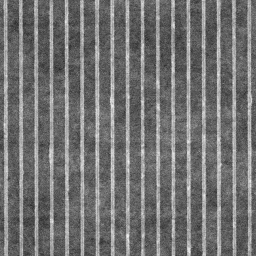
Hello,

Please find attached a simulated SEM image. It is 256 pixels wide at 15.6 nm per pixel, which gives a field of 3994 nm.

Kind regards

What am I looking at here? parallel lines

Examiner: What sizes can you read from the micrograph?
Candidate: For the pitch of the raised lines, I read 238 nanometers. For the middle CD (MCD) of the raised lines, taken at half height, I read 46.8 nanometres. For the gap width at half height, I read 193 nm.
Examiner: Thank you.